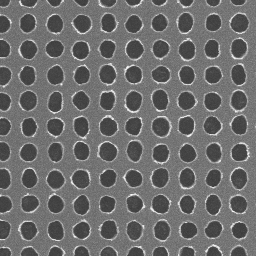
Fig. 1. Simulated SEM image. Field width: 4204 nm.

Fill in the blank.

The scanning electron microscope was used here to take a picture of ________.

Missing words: a regular array of holes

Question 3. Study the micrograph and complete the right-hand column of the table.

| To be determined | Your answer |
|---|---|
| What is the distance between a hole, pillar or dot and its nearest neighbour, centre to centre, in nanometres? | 413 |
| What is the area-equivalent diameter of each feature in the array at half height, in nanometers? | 282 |